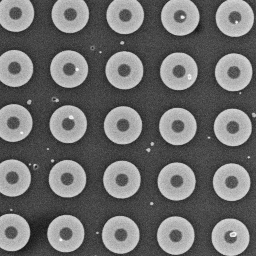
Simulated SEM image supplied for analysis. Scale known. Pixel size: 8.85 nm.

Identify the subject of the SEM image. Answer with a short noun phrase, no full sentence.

an array of small figures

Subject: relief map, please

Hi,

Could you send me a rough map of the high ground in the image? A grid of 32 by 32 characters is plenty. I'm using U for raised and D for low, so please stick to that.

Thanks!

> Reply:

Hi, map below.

UUUUDDDUUUUDDDUUUDDDDUUUDDDDUUUD
UUUUDDDUUUUDDUUUUUDDUUUUUDDUUUUU
UUUUDDDUUUUDDUUUUUDDUUUUUDDUUUUU
DUUDDDDUUUDDDDUUUDDDDUUUDDDUUUUD
DDDDDDDDDDDDDDDDDDDDDDDDDDDDDUDD
DDDDDDDDDDDDDDDDDDDDDDDDDDDDDDDD
DUUDDDDDUDDDDDDUDDDDDDDDDDDDDDDD
UUUUDDDUUUUDDDUUUDDDDUUUDDDDUUUD
UUUUDDUUUUUDDUUUUUDDUUUUUDDUUUUD
UUUUDDUUUUUDDUUUUUDDUUUUUDDUUUUD
DUUDDDDUUUDDDDUUUDDDDUUUDDDUUUUD
DDDDDDDDDDDDDDDDDDDDDDDDDDDDDDDD
DDDDDDDDDDDDDDDDDDDDDDDDDDDDDDDD
UUUDDDDUUUDDDDDUDDDDDDDDDDDDDDDD
UUUUDDUUUUUDDUUUUDDDUUUUDDDUUUUD
UUUUDDUUUUUDDUUUUUDDUUUUUDDUUUUD
UUUUDDUUUUUDDUUUUUDDUUUUDDDUUUUD
DUUDDDDUUUDDDDUUUDDDDUUUDDDUUUUD
DDDDDDDDDDDDDDDDDDDDDDDDDDDDDDDD
DDDDDDDDDDDDDDDDDDDDDDDDDDDDDDDD
UUUDDDDUUUDDDDUUUDDDDUUDDDDDUUDD
UUUUDDUUUUUDDUUUUDDDUUUUDDDUUUUD
UUUUDDUUUUUDDUUUUDDDUUUUDDDUUUUD
UUUDDDUUUUDDDUUUUDDDUUUUDDDUUUUD
DUDDDDDDUDDDDDUUDDDDDUUUDDDUUUDD
DDDDDDDDDDDDDDDDDDDDDDDDDDDDDDDD
DDDDDDDDDDDDDDDDDDDDDDDDDDDDDDDD
UUUDDDDUUUDDDDUUDDDDDUUDDDDDUUDD
UUUUDDUUUUDDDUUUUDDDUUUUDDDUUUUD
UUUUDDUUUUDDDUUUUDDDUUUUDDDUUUUD
UUUDDDUUUUDDDUUUUDDDUUUUDDDUUUUD
DDDDDDDDDDDDDDUUDDDDDUUDDDDUUUDD